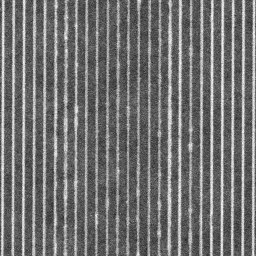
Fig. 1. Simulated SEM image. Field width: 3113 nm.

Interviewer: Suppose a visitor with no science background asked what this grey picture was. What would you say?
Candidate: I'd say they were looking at parallel lines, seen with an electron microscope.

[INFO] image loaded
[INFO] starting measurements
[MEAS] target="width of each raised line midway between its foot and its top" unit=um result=0.0213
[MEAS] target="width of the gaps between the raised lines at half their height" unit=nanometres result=105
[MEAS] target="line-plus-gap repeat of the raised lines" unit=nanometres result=127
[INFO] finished